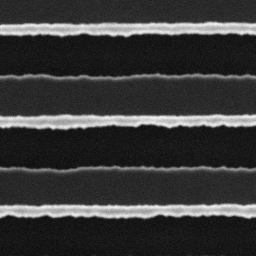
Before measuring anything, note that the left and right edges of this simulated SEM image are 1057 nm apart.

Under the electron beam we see lines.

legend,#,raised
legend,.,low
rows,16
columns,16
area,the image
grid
################
################
................
................
................
################
################
################
................
................
.....####...#...
################
################
##########.##.##
................
................